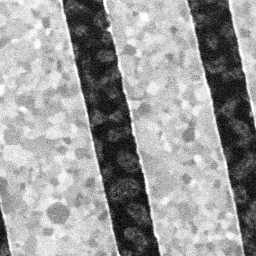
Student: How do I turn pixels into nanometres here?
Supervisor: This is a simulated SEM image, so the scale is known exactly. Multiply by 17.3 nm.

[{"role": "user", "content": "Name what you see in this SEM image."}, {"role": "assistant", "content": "one or a few lines or trenches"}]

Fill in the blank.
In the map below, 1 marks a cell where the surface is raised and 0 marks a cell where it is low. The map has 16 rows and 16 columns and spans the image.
1111000111110011
1111000111110001
1111000111110001
1111100111110001
1111100011111001
1111100011111001
1111100011111000
1111110011111000
1111110011111100
1111110001111100
1111110001111100
1111110001111100
1111111001111110
1111111001111110
1111111000111110
0111111000111110